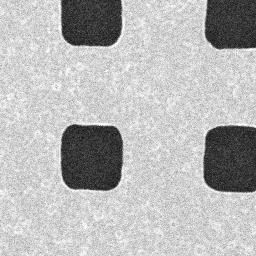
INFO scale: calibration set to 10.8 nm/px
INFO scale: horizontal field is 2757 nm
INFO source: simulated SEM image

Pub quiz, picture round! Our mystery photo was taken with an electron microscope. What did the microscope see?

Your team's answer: holes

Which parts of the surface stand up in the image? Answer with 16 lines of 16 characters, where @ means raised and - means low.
@@@@----@@@@@---
@@@@----@@@@@---
@@@@---@@@@@@---
@@@@@@@@@@@@@@@@
@@@@@@@@@@@@@@@@
@@@@@@@@@@@@@@@@
@@@@@@@@@@@@@@@@
@@@@@@@@@@@@@@@@
@@@@----@@@@@---
@@@@----@@@@@---
@@@@----@@@@@---
@@@@---@@@@@@---
@@@@@@@@@@@@@@@@
@@@@@@@@@@@@@@@@
@@@@@@@@@@@@@@@@
@@@@@@@@@@@@@@@@